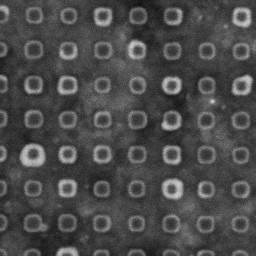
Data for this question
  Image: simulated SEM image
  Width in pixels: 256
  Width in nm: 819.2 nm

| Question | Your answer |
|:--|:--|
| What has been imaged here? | a regular array of raised bodies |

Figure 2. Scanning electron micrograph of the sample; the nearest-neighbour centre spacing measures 0.11 um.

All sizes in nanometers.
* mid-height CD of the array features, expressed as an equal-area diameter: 56